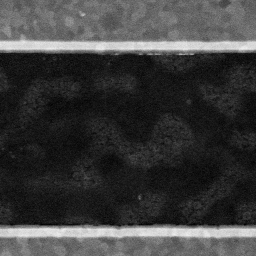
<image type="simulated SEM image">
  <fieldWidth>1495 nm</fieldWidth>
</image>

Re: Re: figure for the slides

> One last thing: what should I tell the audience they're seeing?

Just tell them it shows one or a few lines or trenches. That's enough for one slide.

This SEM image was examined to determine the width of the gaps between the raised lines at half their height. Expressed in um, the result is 1.09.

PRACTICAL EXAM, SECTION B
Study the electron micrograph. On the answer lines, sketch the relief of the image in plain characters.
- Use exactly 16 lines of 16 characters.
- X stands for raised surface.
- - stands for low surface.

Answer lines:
XXXXXXXXXXXXXXXX
XXXXXXXXXXXXXXXX
XXXXXXXXXXXXXXXX
----------------
----------------
----------------
----------------
----------------
----------------
----------------
----------------
----------------
----------------
----------------
---XX---XXXX----
XXXXXXXXXXXXXXXX